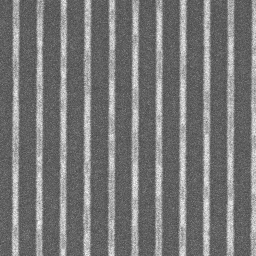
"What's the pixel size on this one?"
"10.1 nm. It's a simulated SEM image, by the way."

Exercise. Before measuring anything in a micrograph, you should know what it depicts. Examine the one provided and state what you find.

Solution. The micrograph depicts parallel lines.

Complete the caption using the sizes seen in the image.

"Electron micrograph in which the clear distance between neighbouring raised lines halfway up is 201 nanometres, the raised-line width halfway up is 39 nanometres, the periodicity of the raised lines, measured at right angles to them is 240 nm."